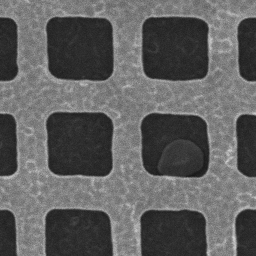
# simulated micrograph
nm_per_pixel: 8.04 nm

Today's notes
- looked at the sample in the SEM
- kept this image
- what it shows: holes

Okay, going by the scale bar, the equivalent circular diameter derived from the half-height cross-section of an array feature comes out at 577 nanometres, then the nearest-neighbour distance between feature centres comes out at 764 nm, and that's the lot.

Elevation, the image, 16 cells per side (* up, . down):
****************
.**....**....**.
.**....**....**.
.**....**....**.
.**....**....**.
****************
****************
.**....**....**.
.**....**....**.
.**....**....**.
.**....**....**.
****************
****************
.**....**....**.
.**....**....**.
.**....**....**.